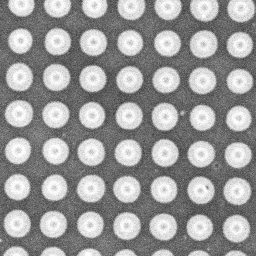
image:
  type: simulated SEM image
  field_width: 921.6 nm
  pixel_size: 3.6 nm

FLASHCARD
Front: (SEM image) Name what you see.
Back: an array of small figures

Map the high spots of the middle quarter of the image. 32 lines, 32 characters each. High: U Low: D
DDDDDDDDDDDDDDDDDDDDDDDDDDDDDDDD
UDDDDUUUUUDDDDUUUUUDDDDDUUUUDDDD
UDDDUUUUUUDDDDUUUUUDDDDUUUUUDDDD
UDDDUUUUUUDDDUUUUUUUDDUUUUUUUDDU
UDDDUUUUUUDDDUUUUUUUDDUUUUUUUDDU
UDDDUUUUUUDDDUUUUUUDDDDUUUUUDDDD
DDDDDDUUUDDDDDUUUUDDDDDUUUUUDDDD
DDDDDDDDDDDDDDDDDDDDDDDDDDDDDDDD
DDDDDDDDDDDDDDDDDDDDDDDDDDDDDDDD
DDDDDDDDDDDDDDDDDDDDDDDDDDDDDDDD
DDDDDUUUUDDDDDUUUUDDDDDUUUUDDDDD
UDDDUUUUUUDDDUUUUUUDDDDUUUUUDDDD
UDDDUUUUUUDDDUUUUUUDDDUUUUUUDDDD
UDDDUUUUUUDDDUUUUUUDDDUUUUUUDDDD
UDDDUUUUUUDDDUUUUUUDDDUUUUUUDDDD
DDDDDUUUUDDDDDUUUUUDDDDUUUUDDDDD
DDDDDDDDDDDDDDDDDDDDDDDDDDDDDDDD
DDDDDDDDDDDDDDDDDDDDDDDDDDDDDDDD
DDDDDDDDDDDDDDDDDDDDDDDDDDDDDDDD
DDDDDUUUUDDDDDUUUUDDDDDUUUUDDDDD
UDDDUUUUUUDDDUUUUUUDDDDUUUUUDDDD
UDDDUUUUUUDDDUUUUUUDDDUUUUUUDDDU
UDDDUUUUUUDDDUUUUUUDDDUUUUUUDDDU
UDDDUUUUUUDDDUUUUUUDDDUUUUUUDDDU
DDDDDUUUUDDDDDUUUUDDDDDUUUUUDDDD
DDDDDDDDDDDDDDDDDDDDDDDDDUDDDDDD
DDDDDDDDDDDDDDDDDDDDDDDDDDDDDDDD
DDDDDDDDDDDDDDDDDDDDDDDDDDDDDDDD
DDDDDUUUUDDDDDUUUDDDDDDDUUDDDDDD
DDDDUUUUUUDDDUUUUUUDDDUUUUUUDDDD
UDDUUUUUUUDDDUUUUUUDDDUUUUUUDDDU
UDDUUUUUUUDDUUUUUUUDDDUUUUUUDDDU